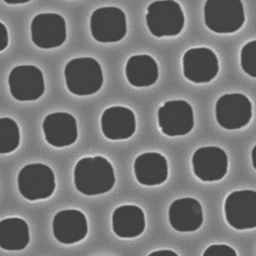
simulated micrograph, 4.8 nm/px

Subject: a regular array of holes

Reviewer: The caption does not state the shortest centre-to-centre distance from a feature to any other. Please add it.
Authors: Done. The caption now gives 272 nanometers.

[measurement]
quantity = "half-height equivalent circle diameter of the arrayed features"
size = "171 nm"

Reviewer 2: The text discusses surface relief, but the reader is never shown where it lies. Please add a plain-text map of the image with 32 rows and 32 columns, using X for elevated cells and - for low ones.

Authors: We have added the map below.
XXXXXXXXXXXXXXXXXXX---XXXX----XX
XXXXXXXXXXXX---XXX-----XX-----XX
XXXX----XXX-----XX-----XXX----XX
-XXX----XXX-----XXX----XXX----XX
-XXX----XXXX---XXXXXXXXXXXXXXXXX
-XXX----XXXXXXXXXXXXXXXXXXXXXXX-
XXXXXXXXXXXXXXXXXXXXXXX----XXX--
XXXXXXXXX---XXXX---XXXX----XXX--
XX---XXX-----XXX----XXX----XXX--
X----XXX-----XXX----XXX----XXXX-
X-----XX-----XXX---XXXXXXXXXXXXX
X----XXXX---XXXXXXXXXXXXXXXXXXXX
XX--XXXXXXXXXXXXXXXXXXXXXXX----X
XXXXXXXXXXXXXX--XXXX----XXX----X
XXXXXX---XXXX----XXX----XXX----X
--XXX-----XXX----XXX----XXX----X
--XXXX----XXX----XXX----XXXXXXXX
--XXXX---XXXXXXXXXXXXXXXXXXXXXXX
--XXXXXXXXXXXXXXXXXXXXXXX--XXXXX
XXXXXXXXXXXXXXXXXX--XXXX----XXXX
XXXX-XXXXX----XXX----XXX----XXXX
XX-----XX-----XXX----XXX----XXXX
XX-----XX-----XXX----XXXX--XXXXX
XX-----XXX----XXXXXXXXXXXXXXXXXX
XXX---XXXXXXXXXXXXXXXXXXXXXXX---
XXXXXXXXXXXXXXXXXXXXX----XXX----
XXXXXXX---XXXX----XXX----XXX----
---XXXX----XXX----XXX----XXX----
----XXX----XXX----XXXX---XXXX--X
----XXX----XXXX--XXXXXXXXXXXXXXX
---XXXXXXXXXXXXXXXXXXXXXXXXXXXXX
XXXXXXXXXXXXXXXXXXX---XXXX---XXX